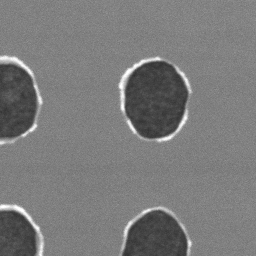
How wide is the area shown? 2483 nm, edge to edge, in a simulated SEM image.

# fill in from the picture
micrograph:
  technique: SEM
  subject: holes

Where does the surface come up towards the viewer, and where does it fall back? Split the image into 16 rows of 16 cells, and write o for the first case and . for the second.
oooooooooooooooo
oooooooooooooooo
oooooooooooooooo
oooooooooooooooo
..oooooo...ooooo
..oooooo....oooo
..oooooo....oooo
..oooooo...ooooo
.oooooooo.oooooo
oooooooooooooooo
oooooooooooooooo
oooooooooooooooo
oooooooooooooooo
.oooooooo..ooooo
..oooooo...ooooo
..oooooo....oooo